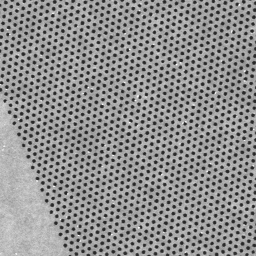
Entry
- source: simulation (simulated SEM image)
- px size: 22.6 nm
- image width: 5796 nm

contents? a regular array of holes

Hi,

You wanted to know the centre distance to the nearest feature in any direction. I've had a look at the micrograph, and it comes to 152 nm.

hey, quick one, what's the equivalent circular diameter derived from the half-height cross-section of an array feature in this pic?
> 84.7 nanometers